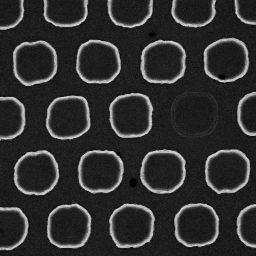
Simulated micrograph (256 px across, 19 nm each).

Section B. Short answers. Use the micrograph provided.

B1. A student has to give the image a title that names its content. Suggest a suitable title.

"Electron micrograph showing a regular array of raised bodies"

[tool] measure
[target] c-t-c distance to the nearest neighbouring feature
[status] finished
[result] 1190 nanometres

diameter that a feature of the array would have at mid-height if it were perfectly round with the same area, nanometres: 830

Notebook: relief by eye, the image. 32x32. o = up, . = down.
ooo...ooooo...ooooo...ooooo...oo
ooo...ooooo...ooooo...ooooo...oo
oo....oooo....oooo....oooo....oo
o...............................
................................
...ooo.....ooo.....ooo.....ooo..
..ooooo...ooooo...ooooo...ooooo.
..ooooo...ooooo...ooooo...ooooo.
..ooooo...ooooo...ooooo...ooooo.
..ooooo...oooo....oooo....oooo..
................................
................................
oo.....oooo...ooooo...........oo
ooo...ooooo...ooooo...........oo
ooo...ooooo...ooooo...........oo
ooo...ooooo...ooooo...........oo
oo....ooooo....ooo.............o
................................
................................
...ooo.....oooo...oooo....oooo..
..ooooo...ooooo...ooooo...ooooo.
..ooooo...ooooo...ooooo...ooooo.
..ooooo...ooooo...ooooo...ooooo.
..oooo.....ooo.....ooo.....ooo..
................................
................................
ooo....oooo...ooooo...ooooo...oo
ooo...ooooo...ooooo...ooooo...oo
ooo...ooooo...ooooo...ooooo...oo
ooo...ooooo...ooooo...ooooo...oo
oo.....ooo.....ooo.....ooo.....o
................................